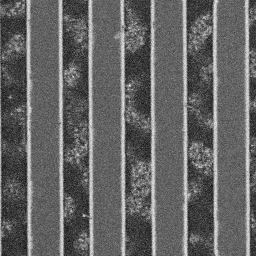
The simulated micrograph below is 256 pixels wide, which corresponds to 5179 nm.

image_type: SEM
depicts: parallel lines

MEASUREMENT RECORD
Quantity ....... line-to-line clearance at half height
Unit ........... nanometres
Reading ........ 614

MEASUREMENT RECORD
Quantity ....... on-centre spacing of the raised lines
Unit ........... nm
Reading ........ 1260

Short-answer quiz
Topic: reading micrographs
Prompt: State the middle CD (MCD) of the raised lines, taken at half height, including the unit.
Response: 655 nm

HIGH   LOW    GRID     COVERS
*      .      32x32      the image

....***....****....****....****.
....***....****....****....****.
....****...****....****....****.
....****...****....****....****.
....****...****....****....****.
....****...****....****....****.
....****...****....****....****.
....****...****....****....****.
....****...****....****....****.
....****...****....****....****.
....****...****....****....****.
....****...****....****....****.
....****...****....****....****.
....****...****....****....****.
....****...****....****....****.
....****...****....****....****.
....****...****....****....****.
....****...****....****....****.
....****...****....****....****.
....****...****....****....****.
....****...****....****....****.
....****...****....****....****.
....****...****....****....****.
....****...****....****....****.
....****...****....****....****.
....****...****....****....****.
....****...****....****....****.
....****...****....****....****.
....****...****....****....****.
....****...****....****....****.
....****...****....****....****.
....****...****....****....****.